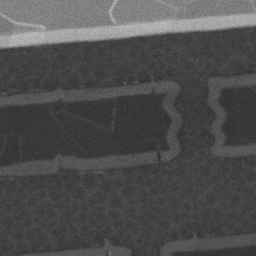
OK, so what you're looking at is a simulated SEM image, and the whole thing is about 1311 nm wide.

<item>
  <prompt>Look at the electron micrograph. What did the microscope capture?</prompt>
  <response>one or a few lines or trenches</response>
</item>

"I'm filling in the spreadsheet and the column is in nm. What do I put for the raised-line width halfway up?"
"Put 356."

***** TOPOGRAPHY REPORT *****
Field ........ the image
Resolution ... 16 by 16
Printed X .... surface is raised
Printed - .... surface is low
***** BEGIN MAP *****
XXXXXXXXXXXXXXXX
XXXXXXXXXXXX----
X---------------
----------------
----------------
---------X---XXX
XXXXXXXXXXX--XXX
XXXXXXXXXXX---XX
XXXXXXXXXXX---XX
XXXXXXXXXXX-----
XXX-------------
----------------
----------------
----------------
----------------
-----------XXXXX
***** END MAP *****